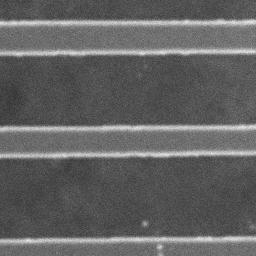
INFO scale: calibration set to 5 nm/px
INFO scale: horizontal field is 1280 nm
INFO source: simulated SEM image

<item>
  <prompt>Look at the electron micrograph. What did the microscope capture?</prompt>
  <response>lines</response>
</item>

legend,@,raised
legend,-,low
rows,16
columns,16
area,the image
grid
----------------
@@@@@@@@@@@@@@@@
@@@@@@@@@@@@@@@@
----------------
----------------
----------------
----------------
----------------
@@@@@@@@@@@@@@@@
@@@@@@@@@@@@@@@@
----------------
----------------
----------------
----------------
----------------
@@@@@@@@@@@@@@@@